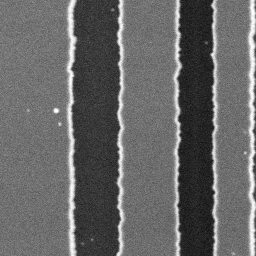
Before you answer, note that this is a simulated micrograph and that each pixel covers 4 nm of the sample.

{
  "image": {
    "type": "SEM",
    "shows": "lines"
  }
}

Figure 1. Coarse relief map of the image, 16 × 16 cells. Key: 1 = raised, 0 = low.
1111000011100111
1111000111100111
1111100111100111
1111000011100111
1111000011100111
1111000011100111
1111000111100111
1111000111100111
1111000111100111
1111000111100111
1111000111100111
1111100111100111
1111000111100111
1111000011100111
1111000111100111
1111100111100111